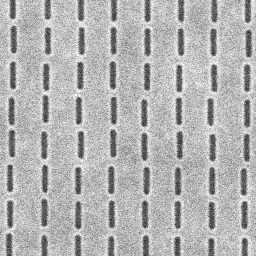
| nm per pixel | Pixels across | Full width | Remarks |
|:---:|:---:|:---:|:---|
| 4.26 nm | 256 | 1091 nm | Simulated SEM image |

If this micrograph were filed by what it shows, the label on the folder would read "a regular array of holes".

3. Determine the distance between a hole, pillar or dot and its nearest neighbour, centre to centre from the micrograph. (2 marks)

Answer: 139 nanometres